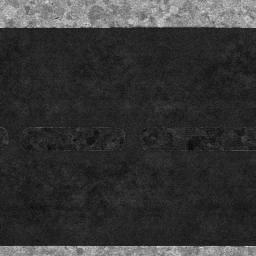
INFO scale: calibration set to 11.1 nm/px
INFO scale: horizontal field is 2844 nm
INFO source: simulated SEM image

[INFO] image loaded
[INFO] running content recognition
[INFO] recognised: one or a few lines or trenches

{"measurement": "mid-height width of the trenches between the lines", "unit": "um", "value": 1.11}